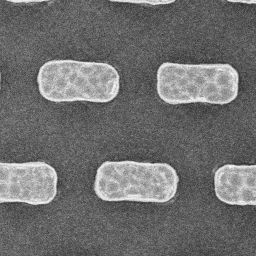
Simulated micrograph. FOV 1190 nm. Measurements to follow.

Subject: raised bodies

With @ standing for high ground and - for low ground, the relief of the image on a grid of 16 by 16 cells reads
----------------
----------------
----------------
----------------
---@@@@---@@@@@-
---@@@@---@@@@@-
----------------
----------------
----------------
----------------
@@@---@@@@@---@@
@@@---@@@@@--@@@
@@@-----@@----@@
----------------
----------------
----------------